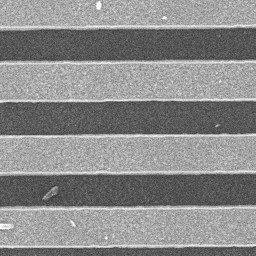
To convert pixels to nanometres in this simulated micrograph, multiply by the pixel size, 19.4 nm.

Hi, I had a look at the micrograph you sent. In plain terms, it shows lines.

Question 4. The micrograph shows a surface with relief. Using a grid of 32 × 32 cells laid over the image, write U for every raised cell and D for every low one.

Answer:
UUUUUUUUUUUUUUUUUUUUUUUUUUUUUUUU
UUUUUUUUUUUUUUUUUUUUUUUUUUUUUUUU
UUUUUUUUUUUUUUUUUUUUUUUUUUUUUUUU
DDDDDDDDDDDDDDDDDDDDDDDDDDDDDDDD
DDDDDDDDDDDDDDDDDDDDDDDDDDDDDDDD
DDDDDDDDDDDDDDDDDDDDDDDDDDDDDDDD
DDDDDDDDDDDDDDDDDDDDDDDDDDDDDDDD
DDDDDDDDDDDDDDDDDDDDDDDDDDDDDDDD
UUUUUUUUUUUUUUUUUUUUUUUUUUUUUUUU
UUUUUUUUUUUUUUUUUUUUUUUUUUUUUUUU
UUUUUUUUUUUUUUUUUUUUUUUUUUUUUUUU
UUUUUUUUUUUUUUUUUUUUUUUUUUUUUUUU
UUUUUUUUUUUUUUUUDUDDDDUUDDDDDDDD
DDDDDDDDDDDDDDDDDDDDDDDDDDDDDDDD
DDDDDDDDDDDDDDDDDDDDDDDDDDDDDDDD
DDDDDDDDDDDDDDDDDDDDDDDDDDDDDDDD
DDDDDDDDDDDDDDDDDDDDDDDDDDDDDDDD
UUUUUUUUUUUUUUUUUUUUUUUUUUUUUUUU
UUUUUUUUUUUUUUUUUUUUUUUUUUUUUUUU
UUUUUUUUUUUUUUUUUUUUUUUUUUUUUUUU
UUUUUUUUUUUUUUUUUUUUUUUUUUUUUUUU
UUUUUUUUUUUUUUUUUUUUUUDDUDDDDDDD
DDDDDDDDDDDDDDDDDDDDDDDDDDDDDDDD
DDDDDDDDDDDDDDDDDDDDDDDDDDDDDDDD
DDDDDDDDDDDDDDDDDDDDDDDDDDDDDDDD
DDDDDDDDDDDDDDDDDDDDDDDDDDDDDDDD
UUUUUUUUUUUUUUUUUUUUUUUUUUUUUUUU
UUUUUUUUUUUUUUUUUUUUUUUUUUUUUUUU
UUUUUUUUUUUUUUUUUUUUUUUUUUUUUUUU
UUUUUUUUUUUUUUUUUUUUUUUUUUUUUUUU
UUUUUUUUUUUUUUUUUUUUUUUUUUUUUUUU
DDDDDDDDDDDDDDDDDDDDDDDDDDDDDDDD